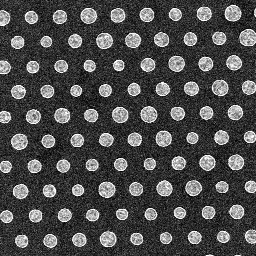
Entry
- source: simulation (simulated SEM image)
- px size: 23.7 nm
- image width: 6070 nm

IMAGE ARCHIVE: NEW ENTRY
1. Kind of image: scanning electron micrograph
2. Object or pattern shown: a regular array of raised bodies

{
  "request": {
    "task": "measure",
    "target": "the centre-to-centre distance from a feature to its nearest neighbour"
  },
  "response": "672 nm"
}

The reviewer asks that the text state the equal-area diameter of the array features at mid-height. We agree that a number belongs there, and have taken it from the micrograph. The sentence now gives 0.306 µm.